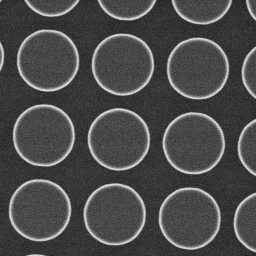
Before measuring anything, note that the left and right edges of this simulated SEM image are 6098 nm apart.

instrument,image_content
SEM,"an array of small figures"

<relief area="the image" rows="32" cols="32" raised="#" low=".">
...#######..#######...#######..#
....####.....#####....######...#
.......................####.....
................................
....####......###...............
...######...######....#####.....
..########..#######...######...#
..########..#######..#######...#
..########..#######..########.##
...######...#######..########.##
....#####...######...#######...#
..............###.....#####....#
................................
....###.........................
...#####....#####.....####......
..#######..#######...######....#
..#######..########..#######..##
..#######..########.########..##
..#######..########.########..##
...#####....######...#######..##
....###.....#####....######...##
.......................###.....#
....#...........................
..######....####................
..######...######....#####.....#
.########..#######..#######...##
.########..#######..#######..###
.########..#######..########.###
..######...#######..#######..###
...####.....#####....######...##
.............##.......####....##
................................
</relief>